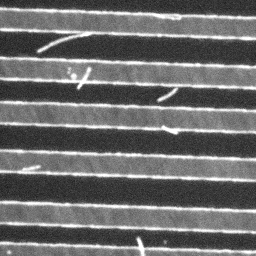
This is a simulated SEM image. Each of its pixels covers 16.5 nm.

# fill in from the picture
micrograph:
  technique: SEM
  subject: lines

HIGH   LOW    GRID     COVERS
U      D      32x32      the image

DDDDDDDDDDDDDDDDDDDDDDDDDDDDDDDD
UUUUUUUUUUUUUDDDDDDDDDDDDDDDDDDD
UUUUUUUUUUUUUUUUUUUUUUUUUUUUUUUU
UUUUUUUUUUUUUUUUUUUUUUUUUUUUUUUU
DDDDDDDDDDDDDDDDDDDDDUUUUUUUUUUU
DDDDDDDDDDDDDDDDDDDDDDDDDDDDDDDD
DDDDDDDDDDDDDDDDDDDDDDDDDDDDDDDD
UUUUUUUUDDDDDDDDDDDDDDDDDDDDDDDD
UUUUUUUUUUUUUUUUUUUUUUUUUUUUUUUU
UUUUUUUUUUUUUUUUUUUUUUUUUUUUUUUU
DDDDDDDDDDDDDDDDDUUUUUUUUUUUUUUU
DDDDDDDDDDDDDDDDDDDDDDDDDDDDDDDD
DDDDDDDDDDDDDDDDDDDDDDDDDDDDDDDD
UUUUUUUUUUUUUUUUUUUUUUUUDDDDDDDD
UUUUUUUUUUUUUUUUUUUUUUUUUUUUUUUU
DUUUUUUUUUUUUUUUUUUUUUUUUUUUUUUU
DDDDDDDDDDDDDDDDDDDDDDDDDDDDUUUU
DDDDDDDDDDDDDDDDDDDDDDDDDDDDDDDD
DDDDDDDDDDDDDDDDDDDDDDDDDDDDDDDD
UUUUUUUUUUUUUUUUUUUUUDDDDDDDDDDD
UUUUUUUUUUUUUUUUUUUUUUUUUUUUUUUU
DDUUUUUUUUUUUUUUUUUUUUUUUUUUUUUU
DDDDDDDDDDDDDDDDDDDDDDDDDDDDDDUU
DDDDDDDDDDDDDDDDDDDDDDDDDDDDDDDD
DDDDDDDDDDDDDDDDDDDDDDDDDDDDDDDD
UUUUUUUUUDDDDDDDDDDDDDDDDDDDDDDD
UUUUUUUUUUUUUUUUUUUUUUUUUUUUUUUU
UUUUUUUUUUUUUUUUUUUUUUUUUUUUUUUU
DDDDDDDDDDDDDDDUUUUUUUUUUUUUUUUU
DDDDDDDDDDDDDDDDDDDDDDDDDDDDDDDD
UUUUUDDDDDDDDDDDDDDDDDDDDDDDDDDD
UUUUUUUUUUUUUUUUUUUUUUUUUUUUUUUU